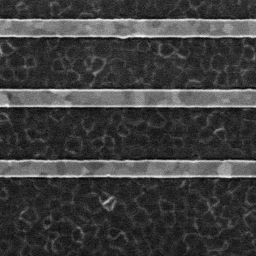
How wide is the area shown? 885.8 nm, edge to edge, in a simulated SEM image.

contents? one or a few lines or trenches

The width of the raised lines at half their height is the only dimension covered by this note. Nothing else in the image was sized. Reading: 0.0562 micrometres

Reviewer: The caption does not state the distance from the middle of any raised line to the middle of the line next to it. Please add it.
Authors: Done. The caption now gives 243 nm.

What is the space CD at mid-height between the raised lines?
186 nm